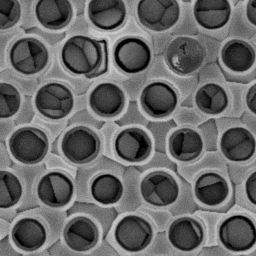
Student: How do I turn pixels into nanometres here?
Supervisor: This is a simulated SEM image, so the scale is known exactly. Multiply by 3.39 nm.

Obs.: a regular array of holes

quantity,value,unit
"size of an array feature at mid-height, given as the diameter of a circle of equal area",35.8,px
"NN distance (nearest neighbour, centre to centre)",173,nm